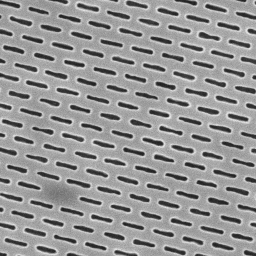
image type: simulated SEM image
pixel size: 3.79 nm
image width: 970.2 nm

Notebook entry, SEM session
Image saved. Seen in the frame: a regular array of holes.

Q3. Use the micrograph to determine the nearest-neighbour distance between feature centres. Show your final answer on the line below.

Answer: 78.1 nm